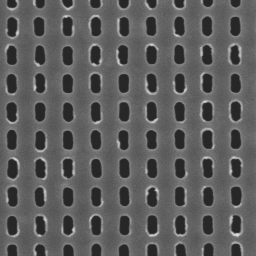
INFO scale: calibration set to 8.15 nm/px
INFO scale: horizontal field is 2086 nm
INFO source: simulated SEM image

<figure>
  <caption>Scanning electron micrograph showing a regular array of holes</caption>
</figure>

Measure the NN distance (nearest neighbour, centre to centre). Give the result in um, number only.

0.226